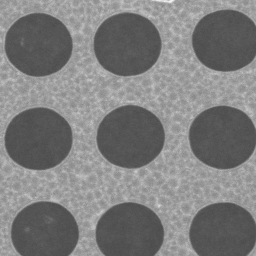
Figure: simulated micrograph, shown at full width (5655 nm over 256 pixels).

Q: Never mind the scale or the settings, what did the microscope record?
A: holes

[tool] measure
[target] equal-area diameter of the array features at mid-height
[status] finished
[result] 1460 nm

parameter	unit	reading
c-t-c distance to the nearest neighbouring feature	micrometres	2